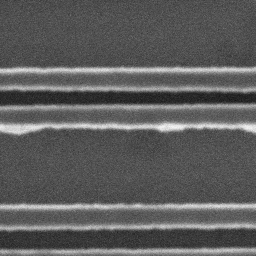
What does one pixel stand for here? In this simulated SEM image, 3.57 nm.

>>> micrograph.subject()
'lines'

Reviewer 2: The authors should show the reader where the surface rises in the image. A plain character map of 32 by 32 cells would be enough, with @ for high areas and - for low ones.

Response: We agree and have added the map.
--------------------------------
--------------------------------
--------------------------------
--------------------------------
--------------------------------
--------------------------------
--------------------------------
--------------------------------
--------------------------------
@@@@@@@@@@@@@@@@@@@@@@@@@@@@@@@@
@@@@@@@@@@@@@@@@@@@@@@@@@@@@@@@@
------------------------------@-
--------------------------------
@@@@@@@@@@@@@@@@@@@@@@@@@@@@@@@@
@@@@@@@@@@@@@@@@@@@@@@@@@@@@@@@@
@@@@@@@@@@@@@@@@@@@@@@@@@@@@@@@@
--------------------------------
--------------------------------
--------------------------------
--------------------------------
--------------------------------
--------------------------------
--------------------------------
--------------------------------
--------------------------------
--------------------------------
@@@@@@@@@@@@@@@@@@@@@@@@@@@@@@@@
@@@@@@@@@@@@@@@@@@@@@@@@@@@@@@@@
@@@@@@@@@@@@@@@@@@@@@----@@-----
--------------------------------
--------------------------------
@@@@@@@@@@@@@@@@@@@@@@@@@@@@@@@@